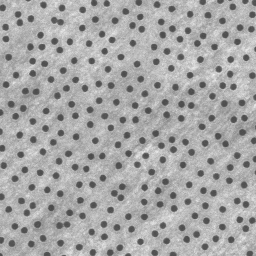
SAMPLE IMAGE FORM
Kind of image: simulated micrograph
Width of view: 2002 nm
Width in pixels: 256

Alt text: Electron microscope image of a regular array of holes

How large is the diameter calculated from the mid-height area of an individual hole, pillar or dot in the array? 6.96 px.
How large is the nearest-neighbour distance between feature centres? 103 nanometres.